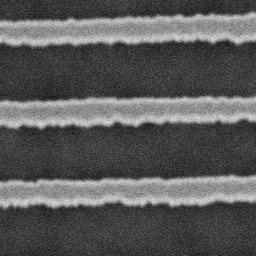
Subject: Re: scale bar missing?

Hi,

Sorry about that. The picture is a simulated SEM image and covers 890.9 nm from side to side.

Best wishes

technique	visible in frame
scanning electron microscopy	lines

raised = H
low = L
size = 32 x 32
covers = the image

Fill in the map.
LLLLLLLLLLLLLLLLLLLLLLLLLLLLLLLL
LLLLLLLLLLLLLLLLLLLLLLLLLLLLLLLL
LLLLLLLLHLHHHHHHHHHHHHHHHHHHHHHH
HHHHHHHHHHHHHHHHHHHHHHHHHHHHHHHH
HHHHHHHHHHHHHHHHHHHHHHHHHHHHHHHH
LHHLHHLLLLLLLLLLLLLLLLLLLLLLLLLL
LLLLLLLLLLLLLLLLLLLLLLLLLLLLLLLL
LLLLLLLLLLLLLLLLLLLLLLLLLLLLLLLL
LLLLLLLLLLLLLLLLLLLLLLLLLLLLLLLL
LLLLLLLLLLLLLLLLLLLLLLLLLLLLLLLL
LLLLLLLLLLLLLLLLLLLLLLLLLLLLLLLL
LLLLLLLLLLLLLLLLLLLLLLLLLLLLLLLL
LLLLLLLLLLLHHHHHHHHHHHHHHHHHHHHH
HHHHHHHHHHHHHHHHHHHHHHHHHHHHHHHH
HHHHHHHHHHHHHHHHHHHHHHHHHHHHHHHH
HHHHHHHHHHHHHHLLHLLLLLLLLLLLLLLL
LLLLLLLLLLLLLLLLLLLLLLLLLLLLLLLL
LLLLLLLLLLLLLLLLLLLLLLLLLLLLLLLL
LLLLLLLLLLLLLLLLLLLLLLLLLLLLLLLL
LLLLLLLLLLLLLLLLLLLLLLLLLLLLLLLL
LLLLLLLLLLLLLLLLLLLLLLLLLLLLLLLL
LLLLLLLLLLLLLLLLLLLLLLLLLLLLLLLL
LLLLLHLHLLLLLHHHHHHHHHHHHHHHHHHH
HHHHHHHHHHHHHHHHHHHHHHHHHHHHHHHH
HHHHHHHHHHHHHHHHHHHHHHHHHHHHHHHH
HHHHLLHHHHLHLLLLHHLLLHLLHLLLLLLL
LLLLLLLLLLLLLLLLLLLLLLLLLLLLLLLL
LLLLLLLLLLLLLLLLLLLLLLLLLLLLLLLL
LLLLLLLLLLLLLLLLLLLLLLLLLLLLLLLL
LLLLLLLLLLLLLLLLLLLLLLLLLLLLLLLL
LLLLLLLLLLLLLLLLLLLLLLLLLLLLLLLL
LLLLLLLLLLLLLLLLLLLLLLLLLLLLLLLL